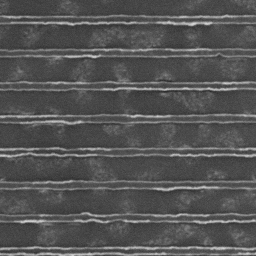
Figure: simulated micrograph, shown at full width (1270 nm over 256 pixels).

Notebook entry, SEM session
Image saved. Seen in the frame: parallel lines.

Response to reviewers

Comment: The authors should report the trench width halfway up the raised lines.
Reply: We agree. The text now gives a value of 125 nm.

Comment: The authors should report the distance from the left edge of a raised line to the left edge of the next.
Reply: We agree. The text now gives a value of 164 nanometers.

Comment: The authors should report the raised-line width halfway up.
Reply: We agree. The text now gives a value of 0.0378 µm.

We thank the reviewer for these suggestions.